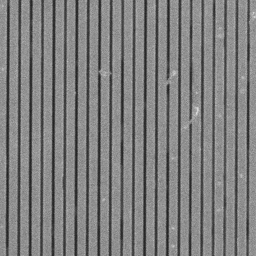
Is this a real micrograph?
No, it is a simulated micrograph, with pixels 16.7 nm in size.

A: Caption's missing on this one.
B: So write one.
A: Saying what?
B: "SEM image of parallel lines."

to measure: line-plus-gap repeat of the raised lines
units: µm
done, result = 0.191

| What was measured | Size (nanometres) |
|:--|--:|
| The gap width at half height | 50.2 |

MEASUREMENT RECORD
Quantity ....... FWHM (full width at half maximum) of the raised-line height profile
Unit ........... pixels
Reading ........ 8.87